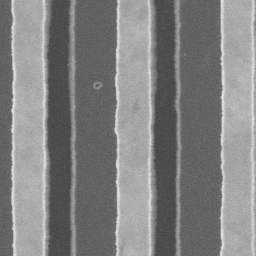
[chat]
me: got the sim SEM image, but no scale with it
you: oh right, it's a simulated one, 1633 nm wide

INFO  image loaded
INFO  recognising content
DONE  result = lines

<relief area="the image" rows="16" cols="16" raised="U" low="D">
UUUDDUUUUDDUUUUU
UUUDDUUUUDDUUUUU
UUUDDUUUUDDUUUUU
UUUDDUUUUDDUUUUU
UUUDDUUUUDDUUUUU
UUUDDUUUUDDUUUUU
UUUDDUUUUDDUUUUU
UUUDDUUUUDDUUUUU
UUUDDUUUUDDUUUUU
UUUDDUUUUDDUUUUU
UUUDDUUUUDDUUUUU
UUUDDUUUUDDUUUUU
UUUDDUUUUDDUUUUU
UUUDDUUUUDDUUUUU
UUUDDUUUUDDUUUUU
UUUDDUUUUDDUUUUU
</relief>